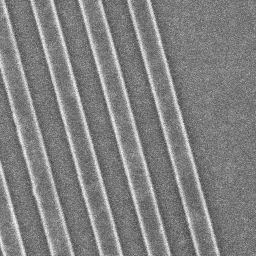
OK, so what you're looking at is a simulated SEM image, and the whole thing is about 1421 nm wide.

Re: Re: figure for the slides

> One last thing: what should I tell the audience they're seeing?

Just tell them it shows parallel lines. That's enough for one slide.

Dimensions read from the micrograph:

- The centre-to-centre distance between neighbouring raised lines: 260 nanometers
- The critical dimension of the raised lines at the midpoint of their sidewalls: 113 nanometers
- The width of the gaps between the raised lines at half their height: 26.8 px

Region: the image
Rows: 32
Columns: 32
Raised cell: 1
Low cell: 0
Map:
10001110001110001110000000000000
10001110001110001110000000000000
10000110000110000110000000000000
10000110000110000111000000000000
11000111000111000111000000000000
11000111000111000011000000000000
11000011000011000011000000000000
11000011100011100011100000000000
11100011100011100011100000000000
11100001100011100001100000000000
01100001100001100001100000000000
01110001110001110001110000000000
01110001110001110001110000000000
01110000110000110000110000000000
00110000110000110000111000000000
00111000111000111000111000000000
00111000111000111000011000000000
00011000011000011000011000000000
00011000011100011100011100000000
00011100011100011100011100000000
00011100001100001100001100000000
00001100001100001100001100000000
10001110001110001110001110000000
10001110001110001110001110000000
10001110000110000110000110000000
10000110000110000110000111000000
11000111000111000111000111000000
11000111000111000011000011000000
11000011000011000011000011000000
11000011000011100011100011100000
11100011100011100011100011100000
11100011100001100001100001100000